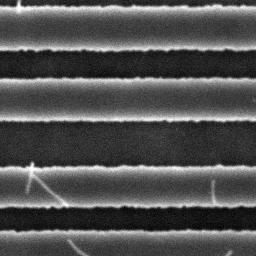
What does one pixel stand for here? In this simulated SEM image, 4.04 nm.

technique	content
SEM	lines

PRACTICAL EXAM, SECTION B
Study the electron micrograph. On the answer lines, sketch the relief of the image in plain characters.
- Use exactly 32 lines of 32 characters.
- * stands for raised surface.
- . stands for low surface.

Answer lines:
................................
********************************
********************************
********************************
********************************
********************************
................................
................................
................................
................................
********************************
********************************
********************************
********************************
********************************
................................
................................
................................
................................
................................
................................
********************************
********************************
********************************
********************************
********************************
................................
................................
................................
********************************
********************************
********************************